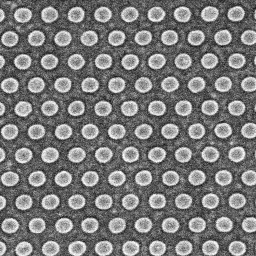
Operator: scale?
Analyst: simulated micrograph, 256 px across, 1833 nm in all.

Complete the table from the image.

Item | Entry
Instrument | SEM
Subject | a regular array of raised bodies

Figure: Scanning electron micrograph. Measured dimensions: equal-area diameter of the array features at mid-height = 109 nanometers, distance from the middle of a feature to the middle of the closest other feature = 189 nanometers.